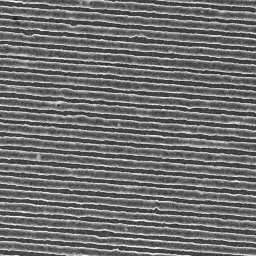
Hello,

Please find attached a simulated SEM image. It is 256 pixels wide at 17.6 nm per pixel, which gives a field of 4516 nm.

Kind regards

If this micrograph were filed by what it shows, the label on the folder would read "parallel lines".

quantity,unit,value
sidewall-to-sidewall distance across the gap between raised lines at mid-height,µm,0.0791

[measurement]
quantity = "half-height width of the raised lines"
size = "154 nanometres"